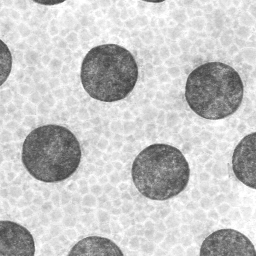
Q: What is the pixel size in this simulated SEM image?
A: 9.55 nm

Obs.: holes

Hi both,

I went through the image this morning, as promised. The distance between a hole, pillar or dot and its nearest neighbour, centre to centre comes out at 938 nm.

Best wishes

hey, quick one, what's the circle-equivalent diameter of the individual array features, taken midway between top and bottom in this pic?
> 560 nanometers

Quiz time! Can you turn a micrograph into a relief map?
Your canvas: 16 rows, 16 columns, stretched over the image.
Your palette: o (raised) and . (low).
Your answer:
oooooooooooooooo
oooooooooooooooo
oooooooooooooooo
.oooo...oooooooo
.oooo....ooo...o
ooooo...oooo...o
oooooooooooo...o
oooooooooooooooo
oo...oooooooooo.
o....oooo..oooo.
oo...ooo....ooo.
oooooooo....ooo.
oooooooooooooooo
oooooooooooooooo
..ooooooooooo..o
..ooo..oooooo...